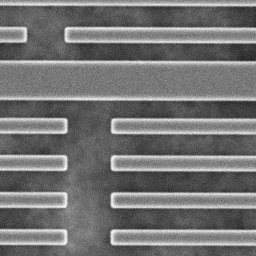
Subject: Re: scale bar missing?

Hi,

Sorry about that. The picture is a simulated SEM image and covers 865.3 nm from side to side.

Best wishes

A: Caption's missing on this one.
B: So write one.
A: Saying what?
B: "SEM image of groups of lines, slits or small figures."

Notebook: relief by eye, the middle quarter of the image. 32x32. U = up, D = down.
UUUUUUUUUUUUUUUUUUUUUUUUUUUUUUUU
UUUUUUUUUUUUUUUUUUUUUUUUUUUUUUUU
UUUUUUUUUUUUUUUUUUUUUUUUUUUUUUUU
UUUUUUUUUUUUUUUUUUUUUUUUUUUUUUUU
UUUUUUUUUUUUUUUUUUUUUUUUUUUUUUUU
UUUUUUUUUUUUUUUUUUUUUUUUUUUUUUUU
UUUUUUUUUUUUUUUUUUUUUUUUUUUUUUUU
UUUUUUUUUUUUUUUUUUUUUUUUUUUUUUUU
UUUUUUUUUUUUUUUUUUUUUUUUUUUUUUUU
DDDDDDDDDDDDDDDDDDDDDDDDDDDDDDDD
DDDDDDDDDDDDDDDDDDDDDDDDDDDDDDDD
DDDDDDDDDDDDDDDDDDDDDDDDDDDDDDDD
DDDDDDDDDDDDDDDDDDDDDDDDDDDDDDDD
DDDDDDDDDDDDDDDDDDDDDDDDDDDDDDDD
UDDDDDDDDDDDUUUUUUUUUUUUUUUUUUUU
UDDDDDDDDDDDUUUUUUUUUUUUUUUUUUUU
UDDDDDDDDDDDUUUUUUUUUUUUUUUUUUUU
DDDDDDDDDDDDDDDDDDDDDDDDDDDDDDDD
DDDDDDDDDDDDDDDDDDDDDDDDDDDDDDDD
DDDDDDDDDDDDDDDDDDDDDDDDDDDDDDDD
DDDDDDDDDDDDDDDDDDDDDDDDDDDDDDDD
DDDDDDDDDDDDDDDDDDDDDDDDDDDDDDDD
DDDDDDDDDDDDDDDDDDDDDDDDDDDDDDDD
UDDDDDDDDDDDUUUUUUUUUUUUUUUUUUUU
UDDDDDDDDDDDUUUUUUUUUUUUUUUUUUUU
UDDDDDDDDDDDUUUUUUUUUUUUUUUUUUUU
DDDDDDDDDDDDUUUUUUUUUUUUUUUUUUUU
DDDDDDDDDDDDDDDDDDDDDDDDDDDDDDDD
DDDDDDDDDDDDDDDDDDDDDDDDDDDDDDDD
DDDDDDDDDDDDDDDDDDDDDDDDDDDDDDDD
DDDDDDDDDDDDDDDDDDDDDDDDDDDDDDDD
DDDDDDDDDDDDDDDDDDDDDDDDDDDDDDDD